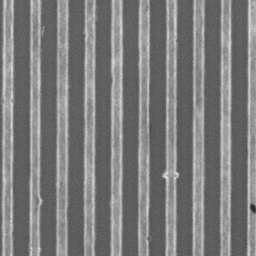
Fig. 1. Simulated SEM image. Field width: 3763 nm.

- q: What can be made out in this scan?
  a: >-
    parallel lines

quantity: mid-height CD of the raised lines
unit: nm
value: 127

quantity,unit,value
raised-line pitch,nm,400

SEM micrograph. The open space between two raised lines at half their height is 268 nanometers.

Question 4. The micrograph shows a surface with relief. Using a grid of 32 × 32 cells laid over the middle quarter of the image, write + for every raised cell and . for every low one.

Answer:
+....+++....++.....++.....++....
+....+++....++.....++.....++....
+....++.....++.....++.....++....
+....++.....++.....++.....++....
+....+++....++.....++.....++....
+....+++....++.....++.....++....
+....+++....++.....++.....++....
+....+++....++.....++.....++....
+....+++....++.....++.....++....
+....+++....++.....++.....++....
+....+++....++.....++.....++....
+....+++....++.....++.....++....
+....+++....++.....++.....++....
+....+++....++.....++.....++....
+....+++....++.....++.....++....
+.....++....++.....++.....++....
+....+++....++.....++.....++....
+....++.....++.....++.....++....
+....++.....++.....++.....++....
+....++.....++.....++.....++....
+....++.....++.....++.....++....
+....++.....++.....++.....++....
+....++.....++.....++.....++....
+....++.....++.....++.....++....
+....++.....++.....++.....++....
+....++.....++.....++.....++....
+....++.....++.....++.....++....
+....++.....++.....++....+++....
+....++.....++.....++....+++....
+....++.....++.....++.....++....
+....++.....++.....++.....++....
.....++.....++.....++.....++....